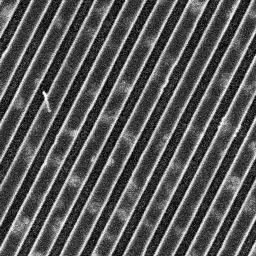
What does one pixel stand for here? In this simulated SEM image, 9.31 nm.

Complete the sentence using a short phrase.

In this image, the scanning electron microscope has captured parallel lines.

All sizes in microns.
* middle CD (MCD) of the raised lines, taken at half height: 0.161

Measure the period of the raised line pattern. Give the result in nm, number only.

262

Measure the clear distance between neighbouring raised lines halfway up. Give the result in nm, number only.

98.6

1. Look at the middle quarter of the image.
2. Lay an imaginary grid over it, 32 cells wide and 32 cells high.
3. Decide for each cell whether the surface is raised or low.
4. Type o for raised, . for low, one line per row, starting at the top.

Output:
oooo...ooooo...ooooo...ooooo...o
ooo....oooo....oooo....oooo...oo
ooo...ooooo...ooooo...ooooo...oo
oo....oooo....oooo....oooo...ooo
oo...ooooo...ooooo...ooooo...ooo
o....oooo....oooo....oooo...oooo
o...ooooo...ooooo...ooooo...oooo
....ooooo...oooo....oooo...ooooo
...ooooo...ooooo...ooooo...ooooo
...ooooo...oooo....oooo...ooooo.
..ooooo...ooooo...ooooo...ooooo.
..oooo....oooo....oooo...ooooo..
.ooooo...ooooo...oooo....oooo...
.oooo....oooo....oooo...ooooo...
ooooo...ooooo...oooo....oooo....
oooo....oooo....oooo...ooooo...o
oooo...ooooo...oooo....ooooo...o
ooo....oooo...ooooo...ooooo...oo
ooo...ooooo...oooo....ooooo...oo
oo...ooooo...ooooo...ooooo...ooo
oo...ooooo...oooo....ooooo...ooo
o...ooooo...ooooo...ooooo...oooo
o...ooooo...oooo....oooo....oooo
...ooooo...ooooo...ooooo...ooooo
...ooooo...oooo....oooo....oooo.
..ooooo...ooooo...ooooo...ooooo.
..ooooo...oooo....oooo....oooo..
.ooooo...ooooo...ooooo...ooooo..
.ooooo...oooo....oooo....oooo...
ooooo...ooooo...ooooo...ooooo...
ooooo...oooo....oooo....oooo....
oooo...ooooo...ooooo...ooooo...o